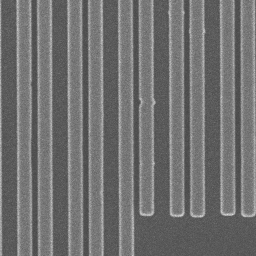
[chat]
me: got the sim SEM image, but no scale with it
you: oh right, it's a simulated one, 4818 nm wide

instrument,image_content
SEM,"parallel lines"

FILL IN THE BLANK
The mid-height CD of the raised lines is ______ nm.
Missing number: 275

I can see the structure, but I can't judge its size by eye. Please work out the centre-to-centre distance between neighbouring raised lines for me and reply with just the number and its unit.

474 nm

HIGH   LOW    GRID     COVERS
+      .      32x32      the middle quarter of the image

.+++..++++....+++..+++....++++..
.+++..++++....+++..+++....++++..
.+++..++++....+++..+++....++++..
.+++..++++....+++..+++....++++..
.+++..++++....+++..+++....++++..
.+++..++++....+++..+++....++++..
.+++..++++....+++..+++....++++..
.+++..++++....+++..+++....++++..
.+++..++++....+++..++++...++++..
.+++..++++....+++..++++...++++..
.+++..++++....+++..++++...++++..
.+++..++++....+++..+++....++++..
.+++..++++....+++..+++....++++..
.+++..++++....+++..+++....++++..
.+++..++++....+++..+++....++++..
.+++..++++....+++..+++....++++..
.+++..++++....+++..+++....++++..
.+++..++++....+++..+++....++++..
.+++..++++....+++..+++....++++..
.+++..++++....+++..+++....++++..
.+++..++++....+++..+++....++++..
.+++..++++....+++..+++....++++..
.+++..++++....+++..+++....++++..
.+++..++++....+++..+++....++++..
.+++..++++....+++..++++...++++..
.+++..++++....+++..+++.....+++..
.+++..++++....+++..+++.....+++..
.+++..++++....+++..+++.....+++..
.++++.++++....+++..+++.....+++..
.++++.++++....+++..+++.....+++..
.++++.++++....+++..+++.....+++..
.++++.++++....+++..+++.....+++..